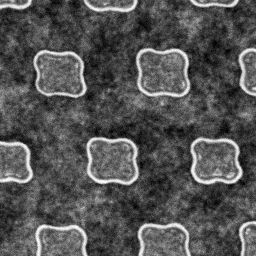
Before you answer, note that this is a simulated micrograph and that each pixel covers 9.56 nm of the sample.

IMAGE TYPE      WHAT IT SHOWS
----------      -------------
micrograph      raised bodies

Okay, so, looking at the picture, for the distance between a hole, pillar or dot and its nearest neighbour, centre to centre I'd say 102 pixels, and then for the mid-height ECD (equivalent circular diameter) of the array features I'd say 49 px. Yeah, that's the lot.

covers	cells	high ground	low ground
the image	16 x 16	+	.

......++........
................
................
..+++....++....+
..+++....+++...+
..+++....+++...+
................
................
................
++....++....+++.
++....+++...+++.
................
................
................
..+++....+++...+
..+++....+++...+